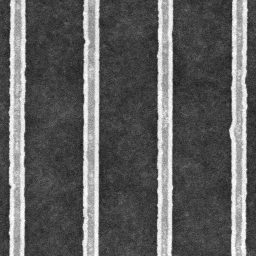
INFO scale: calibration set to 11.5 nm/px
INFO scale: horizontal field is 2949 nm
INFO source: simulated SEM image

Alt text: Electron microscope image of one or a few lines or trenches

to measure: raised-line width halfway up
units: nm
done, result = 132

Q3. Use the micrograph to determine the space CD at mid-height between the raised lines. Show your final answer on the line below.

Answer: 722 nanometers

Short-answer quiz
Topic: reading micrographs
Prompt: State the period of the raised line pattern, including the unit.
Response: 852 nanometres